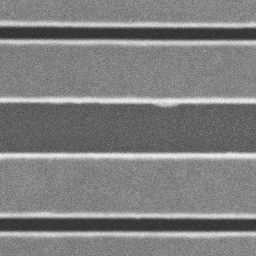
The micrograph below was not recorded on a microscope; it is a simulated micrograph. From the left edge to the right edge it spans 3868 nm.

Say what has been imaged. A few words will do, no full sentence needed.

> lines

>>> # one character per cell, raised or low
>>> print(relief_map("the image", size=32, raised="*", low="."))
********************************
********************************
********************************
................................
................................
********************************
********************************
********************************
********************************
********************************
********************************
********************************
********************************
................................
................................
................................
................................
................................
................................
********************************
********************************
********************************
********************************
********************************
********************************
********************************
********************************
................................
................................
********************************
********************************
********************************